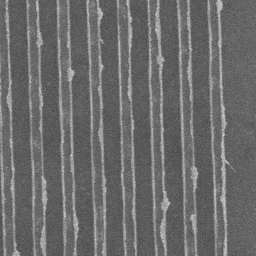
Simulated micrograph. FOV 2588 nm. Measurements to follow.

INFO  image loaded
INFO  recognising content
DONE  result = parallel lines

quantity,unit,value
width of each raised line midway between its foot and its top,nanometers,118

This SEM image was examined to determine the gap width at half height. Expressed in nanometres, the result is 189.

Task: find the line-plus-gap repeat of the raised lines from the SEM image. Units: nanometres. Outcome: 305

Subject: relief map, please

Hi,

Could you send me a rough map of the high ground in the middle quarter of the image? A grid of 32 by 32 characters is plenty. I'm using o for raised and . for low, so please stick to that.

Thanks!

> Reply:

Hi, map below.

o......ooo....oo......ooo....ooo
oo....oooo....oo.....oooo....ooo
oo....ooo.....ooo....ooo.....ooo
oo....ooo.....ooo....ooo.....ooo
oo.....oo.....ooo.....oo.....ooo
oo.....oo.....ooo.....oo.....ooo
o......oo.....ooo.....oo.....ooo
oo.....oo.....ooo.....oo.....ooo
oo.....oo.....ooo.....oo.....ooo
oo.....ooo....ooo.....oo.....ooo
oo.....ooo....ooo.....oo.....ooo
oo.....oo.....ooo.....oo.....ooo
oo.....oo.....ooo.....oo.....ooo
oo.....oo.....ooo.....oo.....ooo
oo.....oo.....ooo.....oo......oo
oo.....ooo....ooo.....ooo....ooo
oo.....ooo....ooo.....ooo....ooo
oo.....ooo.....oo.....ooo.....oo
oo.....ooo....ooo.....ooo.....oo
oo.....ooo....ooo.....ooo.....oo
oo.....ooo....ooo.....ooo.....oo
oo.....ooo.....oo.....ooo.....oo
oo.....ooo.....oo.....ooo.....oo
oo.....ooo.....oo.....ooo.....oo
oo.....ooo.....oo.....ooo.....oo
oo.....ooo.....oo.....ooo.....oo
oo.....ooo.....oo.....ooo.....oo
oo.....ooo....ooo.....ooo.....oo
oo.....ooo....ooo.....ooo.....oo
oo.....ooo.....ooo....ooo.....oo
oo.....ooo.....ooo....ooo.....oo
oo.....ooo.....ooo....ooo.....oo